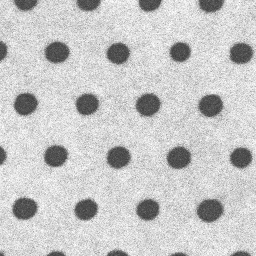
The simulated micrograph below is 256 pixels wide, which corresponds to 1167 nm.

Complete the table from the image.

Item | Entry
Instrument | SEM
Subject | a regular array of holes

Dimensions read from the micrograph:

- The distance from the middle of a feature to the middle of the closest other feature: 274 nm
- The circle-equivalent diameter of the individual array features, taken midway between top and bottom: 105 nm